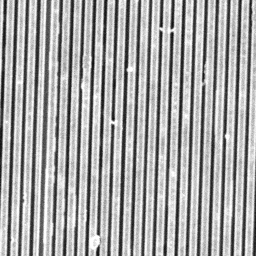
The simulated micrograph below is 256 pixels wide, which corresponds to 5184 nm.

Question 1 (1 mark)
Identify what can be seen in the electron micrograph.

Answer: parallel lines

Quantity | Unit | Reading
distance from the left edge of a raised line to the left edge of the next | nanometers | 226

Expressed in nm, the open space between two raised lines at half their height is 93.6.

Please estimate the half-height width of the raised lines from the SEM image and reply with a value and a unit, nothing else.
132 nanometres